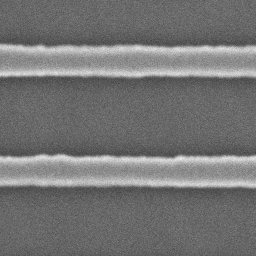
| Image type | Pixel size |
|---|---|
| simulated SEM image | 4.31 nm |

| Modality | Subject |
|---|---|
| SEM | lines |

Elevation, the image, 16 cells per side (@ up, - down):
----------------
----------------
----------------
@@@@@@@@@@@@@@@@
@@@@@@@@@@@@@@@@
----------------
----------------
----------------
----------------
----------------
@@@@@@@@@@@@@@@@
@@@@@@@@@@@@@@@@
----------------
----------------
----------------
----------------